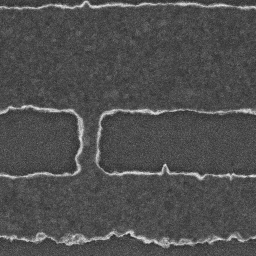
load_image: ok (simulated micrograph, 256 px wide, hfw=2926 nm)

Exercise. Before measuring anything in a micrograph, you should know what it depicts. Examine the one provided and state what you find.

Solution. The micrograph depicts one or a few lines or trenches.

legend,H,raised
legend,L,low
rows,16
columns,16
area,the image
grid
HHHHHHHHHHHHHHHH
HHHHHHHHHHHHHHHH
HHHHHHHHHHHHHHHH
HHHHHHHHHHHHHHHH
HHHHHHHHHHHHHHHH
HHHHHHHHHHHHHHHH
HHHHHHHHHHHHHHHH
LLLLLHLLLLLLLLLL
LLLLLHLLLLLLLLLL
LLLLLHLLLLLLLLLL
LLLLLHLLLLLLLLLL
HHHHHHHHHHHHHHHH
HHHHHHHHHHHHHHHH
HHHHHHHHHHHHHHHH
HHHHHHHHHHHHHHHH
LLLLLLLLLLLLLLLL